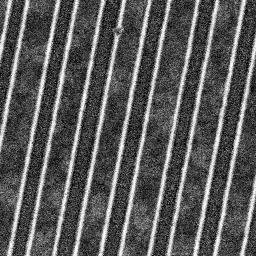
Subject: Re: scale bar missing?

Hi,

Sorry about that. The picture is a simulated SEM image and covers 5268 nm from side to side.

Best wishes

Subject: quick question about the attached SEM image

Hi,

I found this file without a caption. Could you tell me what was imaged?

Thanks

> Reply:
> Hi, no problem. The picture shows parallel lines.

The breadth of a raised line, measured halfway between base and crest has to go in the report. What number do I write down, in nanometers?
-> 538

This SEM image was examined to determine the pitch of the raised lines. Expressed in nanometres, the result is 948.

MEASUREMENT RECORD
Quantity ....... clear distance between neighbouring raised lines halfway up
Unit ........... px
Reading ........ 19.3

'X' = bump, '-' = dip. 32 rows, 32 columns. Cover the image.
X--XXXX---XXX--XXXX--XXXX--XXX--
X--XXXX--XXXX--XXX---XXX---XXX--
X--XXXX--XXX---XXX---XXX---XXX--
X--XXXX--XXX---XXX---XXX---XXX--
---XXX---XXX--XXXX--XXXX--XXXX--
--XXXX---XXX--XXXX--XXXX--XXX---
--XXXX--XXXX--XXX---XXXX--XXX---
--XXXX--XXX---XXX---XXX---XXX---
--XXXX--XXX---XXX---XXX---XXX--X
--XXX---XXX---XXX--XXXX--XXXX--X
-XXXX---XXX---XXX--XXXX--XXXX--X
-XXXX--XXXX--XXX---XXXX--XXX---X
-XXXX--XXX---XXX---XXX---XXX---X
-XXXX--XXX---XXX---XXX---XXX--XX
-XXX---XXX---XXX--XXXX--XXXX--XX
XXXX---XXX---XXX--XXXX--XXXX--XX
XXXX--XXXX--XXXX--XXXX--XXX---XX
XXXX--XXXX--XXX---XXX---XXX---XX
XXXX--XXX---XXX---XXX---XXX--XXX
XXXX--XXX---XXX--XXXX--XXXX--XXX
XXX---XXX---XXX--XXXX--XXXX--XXX
XXX--XXXX--XXXX--XXXX--XXX---XXX
XXX--XXXX--XXX---XXX---XXX---XXX
XXX--XXX---XXX---XXX---XXX--XXXX
XXX--XXX---XXX--XXXX--XXXX--XXXX
XX---XXX---XXX--XXXX--XXXX--XXXX
XX---XXX--XXXX--XXXX--XXX---XXX-
XX--XXXX--XXX---XXX---XXX---XXX-
XX--XXX---XXX---XXX---XXX--XXXX-
XX--XXX---XXX---XXX---XXX--XXXX-
X---XXX---XXX--XXXX--XXXX--XXXX-
X---XXX--XXXX--XXXX--XXX---XXX--